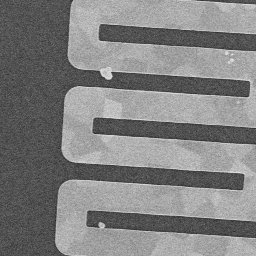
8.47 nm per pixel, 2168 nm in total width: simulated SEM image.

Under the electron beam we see groups of lines, slits or small figures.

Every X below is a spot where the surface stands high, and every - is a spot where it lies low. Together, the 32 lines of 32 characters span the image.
---------XXXXXXXXXXXXXXXXXXXXX--
---------XXXXXXXXXXXXXXXXXXXXXXX
---------XXXXXXXXXXXXXXXXXXXXXXX
---------XXX--------XXXXXXXXXXXX
---------XXX--------------------
---------XXXXXXXX---------------
---------XXXXXXXXXXXXXXXXXXXXXXX
---------XXXXXXXXXXXXXXXXXXXXXXX
----------XXXXXXXXXXXXXXXXXXXXXX
-------------X---------XXXXXXXXX
-------------------------------X
---------XXXXXXXXXX------------X
--------XXXXXXXXXXXXXXXXXXXXXXXX
--------XXXXXXXXXXXXXXXXXXXXXXXX
--------XXXXXXXXXXXXXXXXXXXXXXXX
--------XXXX-------------XXXXXXX
--------XXXX--------------------
--------XXXXXXXXXXXXXX----------
--------XXXXXXXXXXXXXXXXXXXXXXXX
--------XXXXXXXXXXXXXXXXXXXXXXXX
-------------XXXXXXXXXXXXXXXXXXX
----------------------------XXXX
-------------------------------X
-------XXXXXXXXXXXXXXXXXX-----XX
-------XXXXXXXXXXXXXXXXXXXXXXXXX
-------XXXXXXXXXXXXXXXXXXXXXXXXX
-------XXXX----XXXXXXXXXXXXXXXXX
-------XXXX-------------------XX
-------XXXXXX-------------------
-------XXXXXXXXXXXXXXXXXXXX-----
-------XXXXXXXXXXXXXXXXXXXXXXXXX
--------XXXXXXXXXXXXXXXXXXXXXXXX